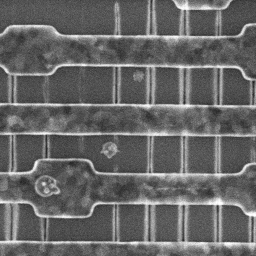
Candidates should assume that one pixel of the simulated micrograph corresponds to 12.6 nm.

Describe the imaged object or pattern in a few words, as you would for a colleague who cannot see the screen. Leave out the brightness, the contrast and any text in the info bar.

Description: wiring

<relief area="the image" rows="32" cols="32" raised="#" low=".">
.......................#####....
................................
................................
.######........................#
###############..###.........###
################################
################################
################################
#######......................###
...............................#
................................
................................
................................
################################
################################
################################
################################
................................
................................
................................
....#######....................#
....########..................##
################################
################################
################################
....#########................###
....#######....................#
................................
................................
................................
####################............
################################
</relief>